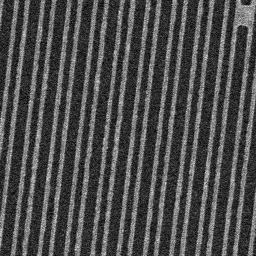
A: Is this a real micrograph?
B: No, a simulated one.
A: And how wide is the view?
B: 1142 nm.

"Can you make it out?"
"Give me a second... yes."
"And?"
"parallel lines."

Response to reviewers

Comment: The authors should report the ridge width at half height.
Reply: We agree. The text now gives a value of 17.1 nm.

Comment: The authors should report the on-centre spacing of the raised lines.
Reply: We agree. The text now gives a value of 58.2 nanometers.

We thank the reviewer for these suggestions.